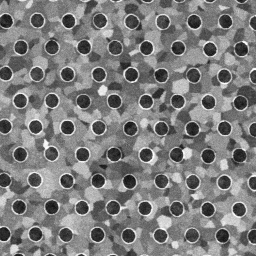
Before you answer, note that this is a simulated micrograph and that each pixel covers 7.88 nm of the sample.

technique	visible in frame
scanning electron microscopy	a regular array of holes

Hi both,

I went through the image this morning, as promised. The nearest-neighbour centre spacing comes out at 239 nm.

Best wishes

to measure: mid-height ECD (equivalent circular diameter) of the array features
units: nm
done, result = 113